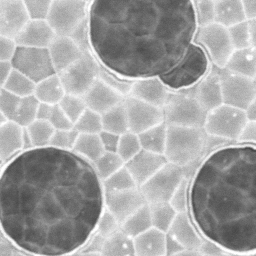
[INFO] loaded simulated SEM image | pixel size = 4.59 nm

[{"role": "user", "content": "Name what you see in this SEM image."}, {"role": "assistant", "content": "holes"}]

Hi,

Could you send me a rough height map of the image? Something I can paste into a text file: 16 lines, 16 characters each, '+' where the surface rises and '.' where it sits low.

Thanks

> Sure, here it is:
++++++......++++
++++++......++++
++++++......++++
++++++.......+++
+++++++......+++
++++++++++++++++
++++++++++++++++
++++++++++++++++
++++++++++++++++
++..++++++++++..
......+++++++...
......++++++....
......++++++....
......++++++....
......+++++++...
+....+++++++++..